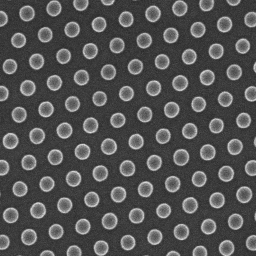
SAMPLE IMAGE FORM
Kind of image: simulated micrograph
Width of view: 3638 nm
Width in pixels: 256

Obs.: a regular array of raised bodies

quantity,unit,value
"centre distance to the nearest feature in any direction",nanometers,387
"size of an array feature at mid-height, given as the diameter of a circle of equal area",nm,210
